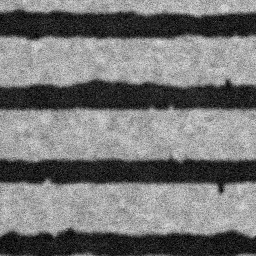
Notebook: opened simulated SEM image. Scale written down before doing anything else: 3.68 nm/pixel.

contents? one or a few lines or trenches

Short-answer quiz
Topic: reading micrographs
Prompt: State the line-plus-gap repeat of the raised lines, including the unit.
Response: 272 nanometres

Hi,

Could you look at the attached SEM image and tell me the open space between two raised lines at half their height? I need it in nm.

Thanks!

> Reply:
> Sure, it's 101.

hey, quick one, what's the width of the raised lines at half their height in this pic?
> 170 nanometers